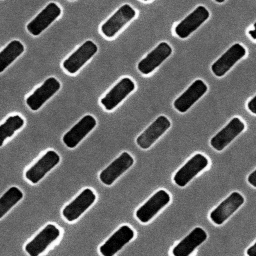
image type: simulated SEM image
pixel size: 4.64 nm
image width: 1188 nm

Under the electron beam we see a regular array of holes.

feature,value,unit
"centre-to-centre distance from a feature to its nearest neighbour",240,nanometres